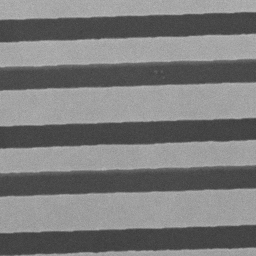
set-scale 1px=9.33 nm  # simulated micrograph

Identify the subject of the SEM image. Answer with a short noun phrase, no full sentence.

lines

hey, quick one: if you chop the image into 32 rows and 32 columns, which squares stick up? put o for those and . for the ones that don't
oooooooooooooooooooooooooooooooo
oooooooooooooooooooooooooooooo..
................................
................................
.........................ooooooo
oooooooooooooooooooooooooooooooo
oooooooooooooooooooooooooooooooo
ooooooooooooooooooooooooooo.....
................................
................................
...........................ooooo
oooooooooooooooooooooooooooooooo
oooooooooooooooooooooooooooooooo
oooooooooooooooooooooooooooooooo
oooooooooooooooooooooooooooooooo
oooooo..........................
................................
................................
....oooooooooooooooooooooooooooo
oooooooooooooooooooooooooooooooo
oooooooooooooooooooooooooooooooo
ooo.............................
................................
................................
....oooooooooooooooooooooooooooo
oooooooooooooooooooooooooooooooo
oooooooooooooooooooooooooooooooo
oooooooooooooooooooooooooooooooo
oooooooooooooooo................
................................
................................
.............ooooooooooooooooooo